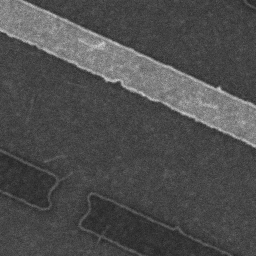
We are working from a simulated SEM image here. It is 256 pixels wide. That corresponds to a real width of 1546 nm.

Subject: one or a few lines or trenches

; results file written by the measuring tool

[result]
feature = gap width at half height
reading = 665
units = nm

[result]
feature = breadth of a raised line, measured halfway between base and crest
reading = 217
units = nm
